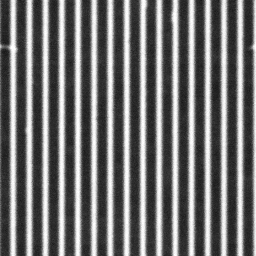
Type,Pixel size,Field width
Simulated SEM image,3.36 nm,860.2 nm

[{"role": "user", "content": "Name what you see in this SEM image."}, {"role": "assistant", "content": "parallel lines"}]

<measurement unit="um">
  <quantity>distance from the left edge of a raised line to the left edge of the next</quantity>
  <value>0.0545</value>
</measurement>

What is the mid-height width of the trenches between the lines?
40.8 nanometers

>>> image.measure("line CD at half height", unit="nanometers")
14.7